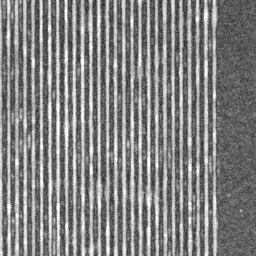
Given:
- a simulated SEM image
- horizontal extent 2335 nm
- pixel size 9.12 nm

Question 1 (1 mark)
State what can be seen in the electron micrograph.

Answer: parallel lines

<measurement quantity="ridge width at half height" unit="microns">0.0228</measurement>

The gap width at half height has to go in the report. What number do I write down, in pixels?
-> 6.13